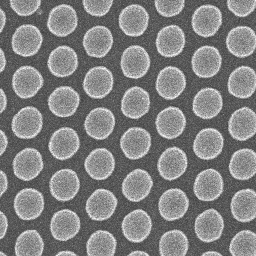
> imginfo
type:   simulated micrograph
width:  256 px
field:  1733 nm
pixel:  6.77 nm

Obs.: a regular array of raised bodies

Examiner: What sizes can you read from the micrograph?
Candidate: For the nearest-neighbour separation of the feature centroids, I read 0.274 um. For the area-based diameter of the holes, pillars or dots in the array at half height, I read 202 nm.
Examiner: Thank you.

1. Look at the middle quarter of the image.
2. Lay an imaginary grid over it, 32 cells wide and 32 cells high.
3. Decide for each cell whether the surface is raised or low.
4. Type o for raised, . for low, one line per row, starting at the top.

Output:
ooo...........ooooooo...........
ooo....oooo....oooooo....oooo...
oo....oooooo...ooooo....oooooo..
.....ooooooo...........ooooooo..
.....ooooooo...........ooooooo..
.....ooooooo...........ooooooo..
oo...oooooo.....oooo...ooooooo..
ooo...ooooo....oooooo...ooooo...
oooo...........oooooo....ooo....
oooo...........oooooo...........
ooo............oooooo...........
ooo....oooo....oooooo....oooo...
oo....oooooo...ooooo....oooooo..
......oooooo.....o.....ooooooo..
.....oooooooo..........ooooooo..
.....ooooooo...........ooooooo..
oo....oooooo....oooo....oooooo..
ooo...ooooo....oooooo...ooooo...
ooo.....oo.....ooooooo....o.....
oooo..........ooooooo...........
oooo..........ooooooo...........
ooo.....ooo....oooooo.....ooo...
oo.....ooooo...ooooo.....ooooo..
o.....oooooo....ooo.....ooooooo.
.....ooooooo............ooooooo.
.....ooooooo............ooooooo.
o.....oooooo............oooooo..
ooo...oooooo....ooooo...ooooo...
ooo....ooo......oooooo...ooo....
oooo...........ooooooo..........
oooo...........ooooooo..........
ooo......o.....oooooo......oo...